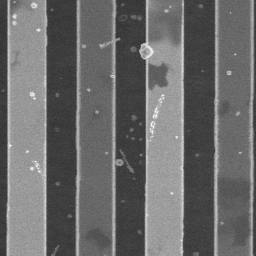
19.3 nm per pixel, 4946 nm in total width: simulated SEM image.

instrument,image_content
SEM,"lines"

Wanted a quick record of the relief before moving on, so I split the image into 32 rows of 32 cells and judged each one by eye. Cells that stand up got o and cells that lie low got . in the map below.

.ooooo....oooo....ooooo....ooooo
.ooooo....oooo....ooooo....ooooo
.ooooo....oooo....ooooo....ooooo
.ooooo....oooo....ooooo....ooooo
.ooooo....ooooo...ooooo....ooooo
.ooooo....oooo....ooooo....ooooo
.ooooo....oooo....ooooo....ooooo
.ooooo....oooo....ooooo....ooooo
.ooooo....oooo....ooooo....ooooo
.ooooo....oooo....ooooo....ooooo
.ooooo....oooo....ooooo....ooooo
.ooooo....oooo....ooooo....ooooo
.ooooo....oooo....ooooo....ooooo
.ooooo....oooo....ooooo....ooooo
.ooooo....oooo....ooooo....ooooo
.ooooo....oooo....ooooo....ooooo
.ooooo....oooo....ooooo....ooooo
.ooooo....oooo....ooooo....ooooo
.ooooo....oooo....ooooo....ooooo
.ooooo....oooo....ooooo....ooooo
.ooooo....oooo....ooooo....ooooo
.ooooo....oooo....ooooo....ooooo
.ooooo....oooo....ooooo....ooooo
.ooooo....oooo....ooooo....ooooo
.ooooo....oooo....ooooo....ooooo
.ooooo....oooo....ooooo....ooooo
.ooooo....oooo....ooooo....ooooo
.ooooo....oooo....ooooo....ooooo
.ooooo....oooo....ooooo....ooooo
.ooooo....oooo....ooooo....ooooo
.ooooo....oooo....ooooo....ooooo
.ooooo....oooo....ooooo....ooooo